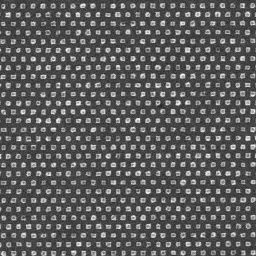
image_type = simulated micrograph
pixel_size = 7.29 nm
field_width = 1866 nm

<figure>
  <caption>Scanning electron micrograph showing a regular array of raised bodies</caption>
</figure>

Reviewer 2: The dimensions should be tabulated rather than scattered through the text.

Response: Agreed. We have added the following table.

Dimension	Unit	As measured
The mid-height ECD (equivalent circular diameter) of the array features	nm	31.9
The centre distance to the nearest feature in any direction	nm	71.1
